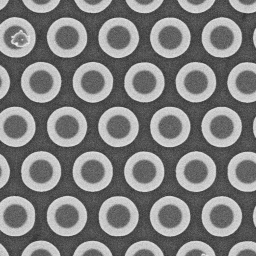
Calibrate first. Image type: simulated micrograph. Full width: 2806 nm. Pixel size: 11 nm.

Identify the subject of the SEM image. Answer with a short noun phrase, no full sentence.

an array of small figures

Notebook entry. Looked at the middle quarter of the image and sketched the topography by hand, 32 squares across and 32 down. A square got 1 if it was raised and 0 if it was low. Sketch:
00001111110000000111111000000011
00011111111000001111111100000111
00011111111100001111111110001111
00111111111100011111111110001111
00111111111100011111111110001111
00111111111100011111111110001111
00011111111100011111111110001111
00011111111000001111111100000111
00001111110000000111111000000011
00000011000000000000000000000000
00000000000000000000000000000000
11100000000111110000000011111000
11110000001111111000000111111100
11111000011111111100001111111110
11111100011111111100001111111110
11111100011111111110001111111110
11111100011111111110001111111110
11111000011111111100001111111110
11111000001111111100001111111110
11110000001111111000000111111100
11000000000011100000000001110000
00000000000000000000000000000000
00000111110000000011110000000001
00011111111000001111111100000111
00011111111000001111111100000111
00111111111100011111111110001111
00111111111100011111111110001111
00111111111100011111111110001111
00111111111100011111111110001111
00011111111000001111111100000111
00001111111000000111111100000111
00000111100000000011110000000001